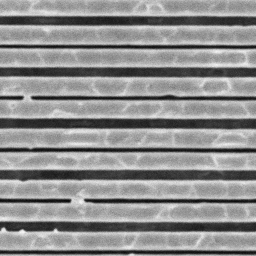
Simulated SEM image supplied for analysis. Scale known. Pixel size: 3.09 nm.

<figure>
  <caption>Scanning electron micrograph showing parallel lines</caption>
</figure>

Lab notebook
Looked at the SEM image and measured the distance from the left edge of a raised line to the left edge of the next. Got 0.0793 um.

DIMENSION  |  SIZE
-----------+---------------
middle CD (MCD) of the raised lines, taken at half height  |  58.2 nm